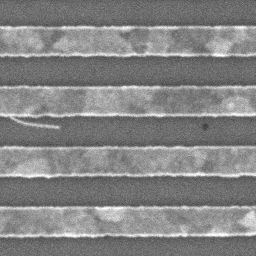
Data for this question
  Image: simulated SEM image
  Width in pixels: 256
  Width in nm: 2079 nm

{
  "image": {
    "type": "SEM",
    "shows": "lines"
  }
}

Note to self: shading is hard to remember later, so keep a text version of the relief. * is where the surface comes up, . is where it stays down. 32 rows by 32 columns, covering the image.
................................
................................
................................
******.*****.*******************
********************************
********************************
********************************
................................
................................
................................
................................
********************************
********************************
********************************
....*...........................
................................
................................
................................
***......**.****.******.********
********************************
********************************
********************************
................................
................................
................................
................................
********************************
********************************
********************************
*************...***.**.....*....
................................
................................